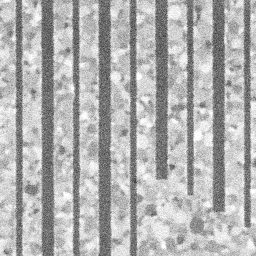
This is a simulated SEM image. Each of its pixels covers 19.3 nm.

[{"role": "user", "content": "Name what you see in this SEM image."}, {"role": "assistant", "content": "parallel lines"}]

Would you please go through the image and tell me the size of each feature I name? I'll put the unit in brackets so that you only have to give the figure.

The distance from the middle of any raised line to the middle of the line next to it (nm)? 559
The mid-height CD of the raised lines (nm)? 348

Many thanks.